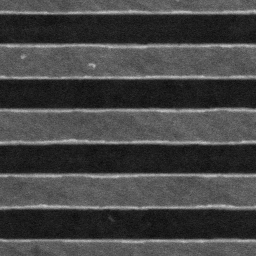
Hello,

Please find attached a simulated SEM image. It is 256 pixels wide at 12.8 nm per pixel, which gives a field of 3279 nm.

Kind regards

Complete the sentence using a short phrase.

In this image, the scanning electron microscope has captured lines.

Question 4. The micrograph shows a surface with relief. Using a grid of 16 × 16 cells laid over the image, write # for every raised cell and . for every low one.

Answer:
################
................
................
################
################
................
................
################
################
................
................
################
################
................
................
################